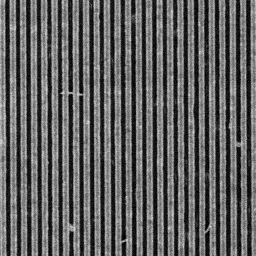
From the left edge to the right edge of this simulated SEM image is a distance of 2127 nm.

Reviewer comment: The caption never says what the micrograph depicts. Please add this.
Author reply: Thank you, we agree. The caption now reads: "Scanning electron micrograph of parallel lines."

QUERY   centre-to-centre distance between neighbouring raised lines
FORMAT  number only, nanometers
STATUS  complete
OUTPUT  87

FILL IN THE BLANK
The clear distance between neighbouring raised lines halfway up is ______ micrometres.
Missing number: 0.0488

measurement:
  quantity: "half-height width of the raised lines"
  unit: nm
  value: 41.5